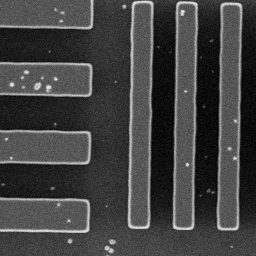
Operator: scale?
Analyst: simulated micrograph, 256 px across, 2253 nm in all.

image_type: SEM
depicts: groups of lines, slits or small figures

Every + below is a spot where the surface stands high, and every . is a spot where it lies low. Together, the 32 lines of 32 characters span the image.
++++++++++++.....++...++........
++++++++++++.....++...+++...++..
+++++++++++......++...+++...++..
.......++++.....+++...+++...++..
................+++...+++...++..
................+++...++....++..
................+++...++....++..
................+++...++....++..
+++++++++++.....+++...++....++..
+++++++++++.....+++...++....++..
+++++++++++.....+++...++....++..
+++++++++++.....+++...++....++..
................+++...++....++..
................+++...++...+++..
................+++...++...+++..
................+++...++...+++..
++++++++........+++...++...+++..
+++++++++++.....+++...++...+++..
+++++++++++.....+++...++...+++..
+++++++++++.....+++...++...+++..
................+++...++...+++..
................+++...++...+++..
................+++...++...+++..
................+++...++...+++..
................+++...++...+++..
+++++++++++.....+++...++...+++..
+++++++++++.....+++...++...+++..
+++++++++++.....+++...++...+++..
+++++++++++...........++....+...
................................
................................
................................